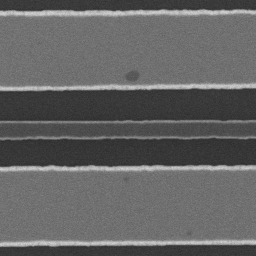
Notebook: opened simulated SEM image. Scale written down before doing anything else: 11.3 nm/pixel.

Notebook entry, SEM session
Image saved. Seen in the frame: lines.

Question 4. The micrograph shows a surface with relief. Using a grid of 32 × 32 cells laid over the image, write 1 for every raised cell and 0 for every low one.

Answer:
00000000000000000000000000000000
00000000000000001111111111111111
11111111111111111111111111111111
11111111111111111111111111111111
11111111111111111111111111111111
11111111111111111111111111111111
11111111111111111111111111111111
11111111111111111111111111111111
11111111111111111111111111111111
11111111111111111111111111111111
11111111111111111111111111111111
00000000000000000000000000000000
00000000000000000000000000000000
00000000000000000000000000000000
00000000000000000000000000000000
11111111111111111111111111111111
11111111111111111111111111111111
00000000000000000000000000000000
00000000000000000000000000000000
00000000000000000000000000000000
00000000000000000000000000000000
11111111111111111111111111111111
11111111111111111111111111111111
11111111111111111111111111111111
11111111111111111111111111111111
11111111111111111111111111111111
11111111111111111111111111111111
11111111111111111111111111111111
11111111111111111111111111111111
11111111111111111111111111111111
11111111111101100000000000000000
00000000000000000000000000000000